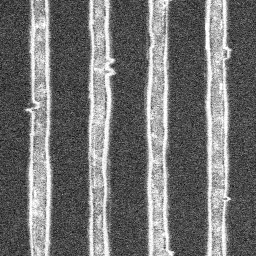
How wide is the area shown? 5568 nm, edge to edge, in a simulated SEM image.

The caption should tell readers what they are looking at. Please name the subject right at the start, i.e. parallel lines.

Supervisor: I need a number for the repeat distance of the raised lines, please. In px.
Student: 59.1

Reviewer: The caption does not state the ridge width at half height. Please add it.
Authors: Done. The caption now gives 0.962 microns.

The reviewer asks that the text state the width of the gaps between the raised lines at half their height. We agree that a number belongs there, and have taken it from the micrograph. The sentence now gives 329 nanometers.